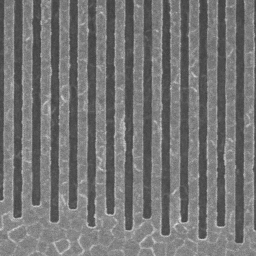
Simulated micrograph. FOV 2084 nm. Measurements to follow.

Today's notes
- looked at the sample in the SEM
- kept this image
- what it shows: parallel lines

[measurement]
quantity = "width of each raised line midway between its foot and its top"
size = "9.5 pixels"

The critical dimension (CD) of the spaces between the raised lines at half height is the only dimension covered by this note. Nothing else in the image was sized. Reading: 72.2 nm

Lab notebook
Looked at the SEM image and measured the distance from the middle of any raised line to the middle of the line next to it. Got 150 nm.